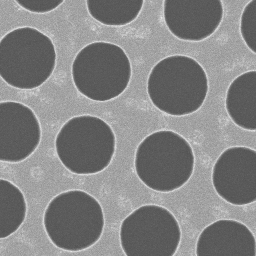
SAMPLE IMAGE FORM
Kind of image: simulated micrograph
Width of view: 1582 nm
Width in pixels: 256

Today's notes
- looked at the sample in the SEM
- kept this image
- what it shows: holes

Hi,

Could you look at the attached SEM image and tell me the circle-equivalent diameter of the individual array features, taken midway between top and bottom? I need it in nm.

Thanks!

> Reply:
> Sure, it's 366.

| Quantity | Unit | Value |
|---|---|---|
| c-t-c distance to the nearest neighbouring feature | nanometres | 474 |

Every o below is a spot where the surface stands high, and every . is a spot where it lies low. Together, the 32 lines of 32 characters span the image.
oo......ooo.......ooo.......ooo.
oooo..ooooo......oooo.......oo..
oooooooooooo.....oooo.......oo..
ooo.ooooooooooooooooo......ooo..
o.....oooooooooooooooo....oooo..
.......oooo...ooooooooooooooooo.
.......ooo.....ooooooooooooooooo
.......oo.......oooo....oooooooo
.......oo.......ooo......ooooooo
......ooo.......ooo.......oooo..
o....oooo.......oo........ooo...
oooooooooo.....oooo.......ooo...
oooooooooooo.oooooo.......oo....
....oooooooooooooooo.....ooo....
....ooooooooooooooooooooooooo...
.....ooo.....ooooooooooooooooo..
.....oo.......oooooo.ooooooooooo
.....oo.......oooo.....ooooooooo
....ooo.......ooo.......ooooo..o
...oooo.......ooo.......oooo....
oooooooo......ooo.......ooo.....
ooooooooo...ooooo.......ooo.....
oooooooooooooooooo.....oooo.....
..ooooooooooooooooo...ooooo.....
...oooo....ooooooooooooooooo....
...ooo......ooooooooooooooooo..o
...ooo.......oooo....ooooooooooo
...ooo.......ooo......oooooooooo
..oooo.......oo.......oooo.....o
.ooooo......ooo........oo.......
ooooooo.....ooo.......ooo.......
oooooooooooooooo......ooo.......